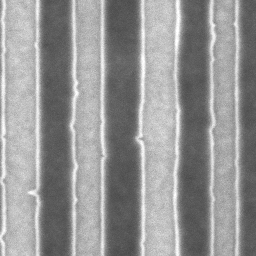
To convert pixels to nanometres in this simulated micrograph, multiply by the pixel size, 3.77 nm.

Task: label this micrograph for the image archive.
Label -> one or a few lines or trenches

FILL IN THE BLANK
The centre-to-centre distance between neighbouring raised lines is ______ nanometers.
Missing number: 262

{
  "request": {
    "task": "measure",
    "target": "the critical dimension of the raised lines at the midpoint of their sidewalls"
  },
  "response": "142 nanometers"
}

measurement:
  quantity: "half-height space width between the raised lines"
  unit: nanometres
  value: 113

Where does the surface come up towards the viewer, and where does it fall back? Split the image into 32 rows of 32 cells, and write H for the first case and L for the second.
HLLLLHHHHLLLLHHHHHLLLLHHHHHLLLHH
LLLLLHHHHLLLLHHHHHLLLLHHHHHLLLHH
LLLLLHHHHLLLLHHHHHLLLLHHHHHLLLHH
LLLLLHHHHLLLLHHHHHLLLLHHHHHLLLHH
LLLLLHHHHLLLLHHHHHLLLLHHHHHLLLHH
LLLLLHHHHLLLLHHHHHLLLLHHHHHLLLHH
HLLLLHHHHLLLLHHHHHLLLLHHHHHLLLHH
LLLLLHHHHLLLLHHHHHLLLLHHHHHLLLHH
LLLLLHHHHLLLLHHHHHLLLLHHHHHLLLHH
LLLLLHHHHLLLLHHHHHLLLLHHHHHLLLHH
LLLLLHHHHHLLLHHHHHLLLLHHHHHLLLHH
LLLLLHHHHHLLLHHHHHLLLLHHHHHLLLHH
LLLLLHHHHLLLLHHHHHLLLLHHHHHLLLHH
LLLLLHHHHLLLLHHHHHLLLLHHHHHLLLHH
LLLLLHHHHLLLLHHHHHLLLLHHHHHLLLHH
LLLLLHHHHLLLLHHHHHLLLLHHHHHLLLHH
LLLLLHHHHLLLLHHHHHLLLLHHHHLLLLHH
LLLLLHHHHLLLLHHHHHLLLLHHHHHLLLHH
LLLLLHHHHLLLLHHHHHLLLLHHHHHLLLHH
LLLLLHHHHLLLLHHHHHLLLLHHHHHLLLHH
LLLLLHHHHLLLLHHHHHLLLLHHHHHLLLHH
LLLLLHHHHLLLLHHHHHLLLLHHHHHLLLHH
LLLLLHHHHLLLLHHHHHLLLLHHHHHLLLHH
LLLLLHHHHLLLLHHHHHLLLLHHHHHLLLHH
LLLLHHHHHLLLLHHHHHLLLLHHHHHLLLHH
LLLLLHHHHLLLLHHHHHLLLLHHHHHLLLHH
LLLLLHHHHLLLLHHHHHLLLLHHHHHLLLHH
LLLLLHHHHLLLLHHHHHLLLLHHHHHLLLHH
LLLLLHHHHLLLLHHHHHLLLLHHHHHLLLHH
LLLLLHHHHLLLLHHHHHLLLLHHHHHLLLHH
LLLLLHHHHLLLLHHHHHLLLLHHHHHLLLHH
LLLLLHHHHLLLLHHHHHLLLLHHHHHLLLHH